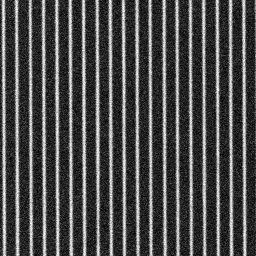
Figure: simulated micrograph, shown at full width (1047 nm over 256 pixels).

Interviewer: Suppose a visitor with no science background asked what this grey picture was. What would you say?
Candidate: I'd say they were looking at parallel lines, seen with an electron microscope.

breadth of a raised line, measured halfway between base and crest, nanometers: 7.7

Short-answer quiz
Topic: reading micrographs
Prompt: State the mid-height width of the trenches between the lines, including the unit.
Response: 47.5 nanometres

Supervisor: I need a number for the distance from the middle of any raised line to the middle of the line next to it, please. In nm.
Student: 54.6